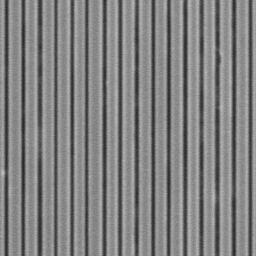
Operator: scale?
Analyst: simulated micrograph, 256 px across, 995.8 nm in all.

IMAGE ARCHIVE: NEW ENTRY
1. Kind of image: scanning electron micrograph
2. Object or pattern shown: parallel lines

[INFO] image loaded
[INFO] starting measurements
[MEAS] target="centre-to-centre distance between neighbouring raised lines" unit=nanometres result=63.3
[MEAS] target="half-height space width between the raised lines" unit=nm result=18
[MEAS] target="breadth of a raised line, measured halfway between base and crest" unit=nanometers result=46.7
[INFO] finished